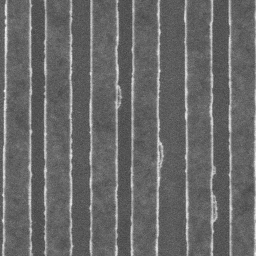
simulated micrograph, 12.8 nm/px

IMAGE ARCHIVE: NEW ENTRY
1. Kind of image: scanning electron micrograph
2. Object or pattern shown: lines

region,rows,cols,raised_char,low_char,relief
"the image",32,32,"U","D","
DUUUDDUUUDDUUUUDDUUUDDDUUUUDDUUU
DUUUDDUUUDDUUUUDDUUUDDDUUUUDDUUU
DUUUDDUUUDDUUUUDDUUUDDDUUUUDDUUU
DUUUDDUUUDDUUUUDDUUUDDDUUUDDDUUU
DUUUDDUUUDDUUUUDDUUUDDDUUUDDDUUU
DUUUDDUUUDDUUUUDDUUUDDDUUUDDDUUU
DUUUDDUUUDDUUUUDDUUUDDDUUUDDDUUU
DUUUDDUUUDDUUUUDDUUUDDDUUUDDDUUU
DUUUDDUUUDDUUUUDDUUUDDDUUUDDDUUU
DUUUDDUUUDDUUUUDDUUUDDDUUUUDDUUU
DUUUDDUUUDDUUUUDDUUUDDDUUUUDDUUU
DUUUDDUUUDDUUUUDDUUUDDDUUUUDDUUU
DUUUDDUUUDDUUUUDDUUUDDDUUUUDDUUU
DUUUDDUUUDDUUUUDDUUUDDDUUUDDDUUU
DUUUDDUUUDDUUUUDDUUUDDDUUUUDDUUU
DUUUDDUUUDDUUUUDDUUUDDDUUUUDDUUU
DUUUDDUUUDDUUUUDDUUUDDDUUUUDDUUU
DUUUDDUUUDDUUUUDDUUUDDDUUUUDDUUU
UUUUDDUUUDDUUUUDDUUUDDDUUUUDDUUU
UUUUDDUUUDDUUUUDDUUUDDDUUUUDDUUU
UUUUDDUUUDDUUUUDDUUUDDDUUUUDDUUU
UUUUDDUUUDDUUUUDUUUUDDDUUUUDDUUU
UUUUDDUUUDDUUUUDUUUUDDDUUUDDDUUU
UUUUDDUUUDDUUUUDUUUUDDDUUUDDDUUU
UUUUDDUUUDDUUUUDDUUUDDDUUUUDDUUU
UUUUDDUUUDDUUUUDDUUUDDDUUUUDDUUU
UUUUDDUUUDDUUUUDDUUUDDDUUUUDDUUU
UUUUDDUUUDDUUUUDDUUUDDDUUUUDDUUU
UUUUDDUUUDDUUUUDUUUUDDDUUUUDDUUU
UUUUDDUUUDDUUUUDUUUUDDDUUUUDDUUU
UUUUDDUUUDDUUUUDUUUUDDDUUUUDDUUU
UUUUDDUUUDDUUUUDUUUUDDDUUUUDDUUU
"